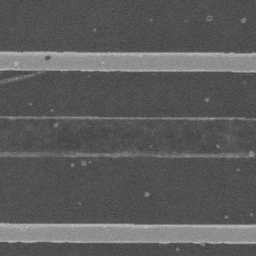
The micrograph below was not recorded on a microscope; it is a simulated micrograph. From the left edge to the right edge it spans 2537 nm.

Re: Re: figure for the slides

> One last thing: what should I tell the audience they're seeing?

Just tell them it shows lines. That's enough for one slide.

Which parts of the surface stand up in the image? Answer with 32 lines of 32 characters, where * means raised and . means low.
................................
................................
................................
................................
................................
................................
................................
********************************
********************************
................................
................................
................................
................................
................................
................................
********************************
********************************
********************************
********************************
................................
................................
................................
................................
................................
................................
................................
................................
................................
********************************
********************************
.........................*......
................................